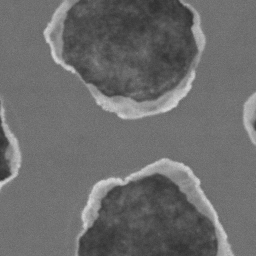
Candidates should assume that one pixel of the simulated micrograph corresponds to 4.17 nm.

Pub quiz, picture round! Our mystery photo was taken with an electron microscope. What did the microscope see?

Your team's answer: holes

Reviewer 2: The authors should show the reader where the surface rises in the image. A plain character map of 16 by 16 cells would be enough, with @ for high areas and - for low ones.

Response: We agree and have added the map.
@@@@--------@@@@
@@@---------@@@@
@@@---------@@@@
@@@@--------@@@@
@@@@@-------@@@@
@@@@@@-----@@@@@
@@@@@@@@--@@@@@@
@@@@@@@@@@@@@@@@
@@@@@@@@@@@@@@@@
-@@@@@@@@@@@@@@@
-@@@@@@@@@@@@@@@
@@@@@@@@----@@@@
@@@@@@-------@@@
@@@@@@-------@@@
@@@@@---------@@
@@@@@---------@@